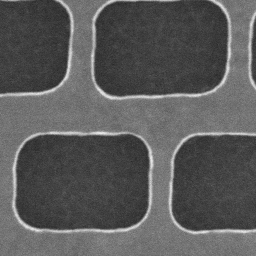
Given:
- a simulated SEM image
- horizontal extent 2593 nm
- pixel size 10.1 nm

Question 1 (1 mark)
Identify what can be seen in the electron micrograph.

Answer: holes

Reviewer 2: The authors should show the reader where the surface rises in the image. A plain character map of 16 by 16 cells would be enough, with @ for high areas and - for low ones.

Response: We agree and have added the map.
----@@--------@@
----@@--------@@
----@@--------@@
----@@--------@@
----@@--------@@
---@@@-------@@@
@@@@@@@@@@@@@@@@
@@@@@@@@@@@@@@@@
@@------@@@@----
@--------@@-----
@--------@@-----
@--------@@-----
@--------@@-----
@--------@@-----
@@@@@@@@@@@@@@@@
@@@@@@@@@@@@@@@@